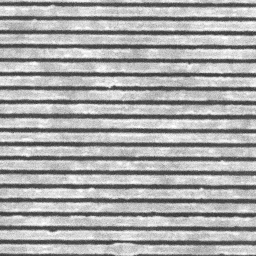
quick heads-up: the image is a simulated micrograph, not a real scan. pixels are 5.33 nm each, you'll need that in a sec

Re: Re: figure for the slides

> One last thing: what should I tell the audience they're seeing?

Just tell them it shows parallel lines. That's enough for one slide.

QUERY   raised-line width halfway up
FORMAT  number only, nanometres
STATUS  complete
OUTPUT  46.6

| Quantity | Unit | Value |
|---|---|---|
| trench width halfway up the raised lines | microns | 0.028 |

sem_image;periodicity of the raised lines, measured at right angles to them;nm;74.5